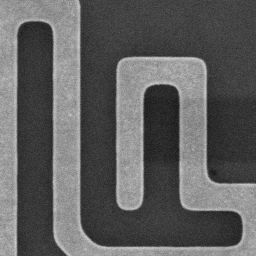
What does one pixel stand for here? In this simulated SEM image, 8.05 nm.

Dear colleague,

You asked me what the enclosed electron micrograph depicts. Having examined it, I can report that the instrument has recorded wiring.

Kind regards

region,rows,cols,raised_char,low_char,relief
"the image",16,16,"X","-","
XXXXX-----------
XX-XX-----------
X--XX-----------
X--XX-----------
X--XX--XXXXXX---
X--XX--XX--XX---
X--XX--XX--XX---
X--XX--XX--XX---
X--XX--XX--XX---
X--XX--XX--XX---
X--XX--XX--XX---
X--XX--XX--XXX--
X--XX--XX--XXXXX
X--XX----------X
X--XX----------X
X---XXXXXXXXXXXX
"